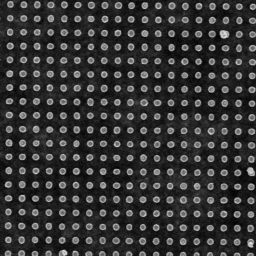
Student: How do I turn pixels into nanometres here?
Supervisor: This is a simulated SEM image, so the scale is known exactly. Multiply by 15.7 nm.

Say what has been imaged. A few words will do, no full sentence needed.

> a regular array of raised bodies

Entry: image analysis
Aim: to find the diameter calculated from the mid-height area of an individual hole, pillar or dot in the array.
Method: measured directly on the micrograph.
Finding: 6.38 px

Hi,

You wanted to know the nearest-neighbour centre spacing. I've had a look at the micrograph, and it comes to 13.3 pixels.